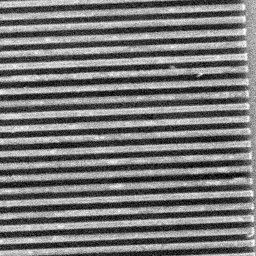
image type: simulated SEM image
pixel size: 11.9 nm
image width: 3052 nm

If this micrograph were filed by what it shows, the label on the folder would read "parallel lines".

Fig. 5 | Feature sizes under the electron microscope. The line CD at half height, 65.5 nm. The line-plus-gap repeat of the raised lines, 148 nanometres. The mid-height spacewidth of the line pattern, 0.0878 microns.